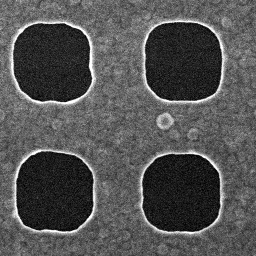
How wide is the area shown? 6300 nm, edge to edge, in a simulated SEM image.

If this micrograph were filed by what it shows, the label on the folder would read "holes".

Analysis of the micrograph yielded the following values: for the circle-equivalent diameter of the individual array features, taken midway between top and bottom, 82.7 px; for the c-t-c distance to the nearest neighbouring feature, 3150 nm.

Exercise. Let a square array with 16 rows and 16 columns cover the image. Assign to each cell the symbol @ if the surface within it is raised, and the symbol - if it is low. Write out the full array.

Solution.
@@@@@@@@@@@@@@@@
@@--@@@@@@--@@@@
@-----@@@-----@@
@-----@@@-----@@
@-----@@@-----@@
@-----@@@-----@@
@@@@@@@@@@@@@@@@
@@@@@@@@@@@@@@@@
@@@@@@@@@@@@@@@@
@@-@@@@@@@@@@@@@
@-----@@@----@@@
@-----@@@-----@@
@-----@@@-----@@
@-----@@@-----@@
@@@@@@@@@@@-@@@@
@@@@@@@@@@@@@@@@